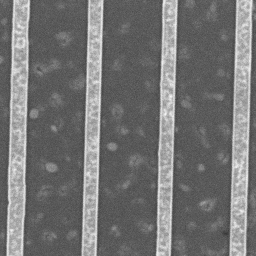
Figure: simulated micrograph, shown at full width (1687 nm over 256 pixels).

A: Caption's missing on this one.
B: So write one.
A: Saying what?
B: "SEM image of one or a few lines or trenches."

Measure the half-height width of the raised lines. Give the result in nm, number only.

86.5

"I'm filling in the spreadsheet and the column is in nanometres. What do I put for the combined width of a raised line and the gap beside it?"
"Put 489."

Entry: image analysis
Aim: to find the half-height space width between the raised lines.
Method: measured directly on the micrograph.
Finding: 398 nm